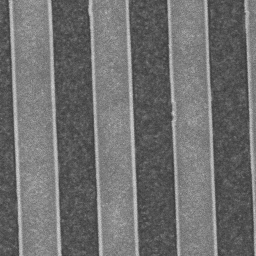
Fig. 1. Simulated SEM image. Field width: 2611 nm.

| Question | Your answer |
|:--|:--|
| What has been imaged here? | one or a few lines or trenches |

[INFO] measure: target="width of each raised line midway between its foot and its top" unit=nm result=380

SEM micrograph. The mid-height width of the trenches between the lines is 419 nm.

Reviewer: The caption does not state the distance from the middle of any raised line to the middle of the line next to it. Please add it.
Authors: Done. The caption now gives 800 nm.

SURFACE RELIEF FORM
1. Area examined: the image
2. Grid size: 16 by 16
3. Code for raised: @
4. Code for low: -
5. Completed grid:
-@@---@@---@@--@
-@@---@@---@@--@
-@@---@@---@@--@
-@@---@@---@@---
-@@---@@---@@---
-@@---@@---@@---
-@@---@@---@@---
-@@---@@---@@---
-@@---@@---@@---
-@@---@@---@@---
-@@@--@@---@@---
-@@@--@@---@@---
-@@@--@@---@@---
-@@@--@@---@@---
-@@@--@@@--@@---
-@@@--@@@--@@---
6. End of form